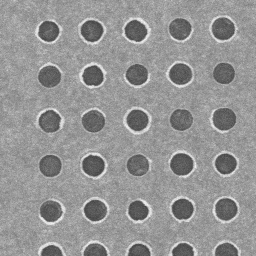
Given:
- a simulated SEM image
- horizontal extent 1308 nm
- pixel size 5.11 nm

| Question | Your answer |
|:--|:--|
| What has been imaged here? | a regular array of holes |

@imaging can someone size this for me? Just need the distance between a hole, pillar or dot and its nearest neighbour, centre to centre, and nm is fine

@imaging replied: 221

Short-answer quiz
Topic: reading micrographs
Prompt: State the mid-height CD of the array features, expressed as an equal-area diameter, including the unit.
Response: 116 nm